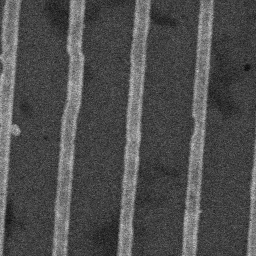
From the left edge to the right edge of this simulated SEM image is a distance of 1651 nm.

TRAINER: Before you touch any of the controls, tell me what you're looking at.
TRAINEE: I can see one or a few lines or trenches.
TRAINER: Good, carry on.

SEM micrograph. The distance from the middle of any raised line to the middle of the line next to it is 416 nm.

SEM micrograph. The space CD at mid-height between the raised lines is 351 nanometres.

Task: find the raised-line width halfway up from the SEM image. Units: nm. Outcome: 70